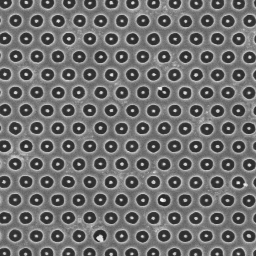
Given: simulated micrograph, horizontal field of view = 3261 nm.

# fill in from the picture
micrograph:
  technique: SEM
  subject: a regular array of ring-shaped grooves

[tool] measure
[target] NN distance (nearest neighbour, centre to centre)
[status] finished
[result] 261 nm